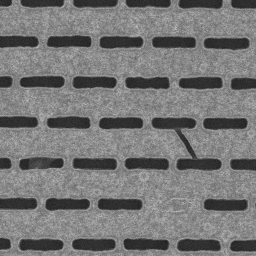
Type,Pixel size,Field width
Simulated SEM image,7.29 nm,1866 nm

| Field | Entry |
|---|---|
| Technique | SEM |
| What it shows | a regular array of holes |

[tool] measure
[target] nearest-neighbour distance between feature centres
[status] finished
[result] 350 nm